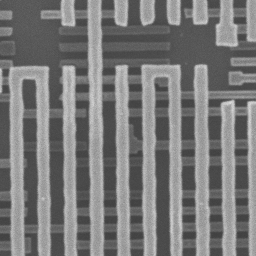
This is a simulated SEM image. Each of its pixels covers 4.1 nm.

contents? wiring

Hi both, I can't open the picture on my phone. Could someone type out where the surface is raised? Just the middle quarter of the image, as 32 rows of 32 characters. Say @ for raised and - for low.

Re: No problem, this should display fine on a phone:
------@@@@----@@----@@@-@@@@@---
@@@---@@@----@@@----@@@@@@@@@---
@@@---@@@----@@@----@@@@@@@@@---
@@@---@@@----@@@----@@@---@@@---
@@@---@@@----@@@----@@----@@@---
@@@----@@----@@@----@@@---@@@---
@@@----@@----@@@----@@@---@@@---
@@@----@@----@@@----@@@---@@@---
@@@----@@----@@@----@@@---@@@---
@@@----@@----@@@----@@@---@@@---
@@@----@@----@@@----@@@---@@@---
@@@---@@@----@@@----@@@---@@@---
@@@---@@@----@@@----@@@---@@@---
@@@----@@@---@@@----@@@---@@@---
@@@----@@@---@@@----@@@---@@@---
@@@----@@@---@@@----@@@---@@@---
@@@----@@@---@@@----@@@---@@@---
@@@---@@@@---@@@----@@@---@@@---
@@@----@@@---@@@----@@@---@@@---
@@@----@@@---@@@----@@@---@@@---
@@@----@@@---@@@----@@@---@@@---
@@@---@@@@---@@@----@@@---@@@---
@@@---@@@@---@@@----@@@---@@@---
@@@----@@@---@@@----@@@---@@@---
@@@----@@@---@@@----@@@---@@@---
@@@----@@@---@@@----@@@---@@@---
@@@----@@@---@@@----@@@---@@@---
@@@----@@@---@@@----@@@---@@@---
@@@----@@@---@@@----@@@---@@@---
@@@----@@@---@@@----@@@---@@@---
@@@----@@@---@@@----@@@---@@@---
@@@----@@@---@@@----@@@---@@@---